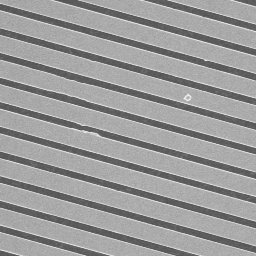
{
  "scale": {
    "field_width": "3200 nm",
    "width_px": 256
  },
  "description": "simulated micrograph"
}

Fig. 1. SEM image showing parallel lines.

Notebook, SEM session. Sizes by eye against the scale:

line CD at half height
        0.209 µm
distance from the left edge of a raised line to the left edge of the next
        297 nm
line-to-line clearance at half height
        0.0844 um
